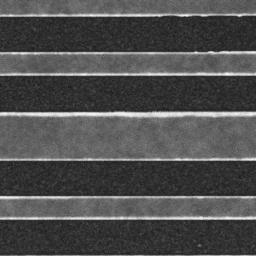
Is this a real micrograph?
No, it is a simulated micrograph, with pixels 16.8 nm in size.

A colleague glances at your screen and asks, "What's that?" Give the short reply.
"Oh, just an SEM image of lines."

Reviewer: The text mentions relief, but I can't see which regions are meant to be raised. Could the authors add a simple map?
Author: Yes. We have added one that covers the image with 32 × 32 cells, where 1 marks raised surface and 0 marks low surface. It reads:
11111111111111111111111111111111
11111111111111111111111111111111
00000000000000000000000000000000
00000000000000000000000000000000
00000000000000000000000000000000
00000000000000000000000000000000
00000000000000000000000000011111
11111111111111111111111111111111
11111111111111111111111111111111
00000000000000000000000000000000
00000000000000000000000000000000
00000000000000000000000000000000
00000000000000000000000000000000
00000000000000000000000000000000
11111111111111111111111111111111
11111111111111111111111111111111
11111111111111111111111111111111
11111111111111111111111111111111
11111111111111111111111111111111
11111111111111111111111111111111
00000000000000000000000000000000
00000000000000000000000000000000
00000000000000000000000000000000
00000000000000000000000000000000
00000000000000000000000000000000
11111111111111111111111111111111
11111111111111111111111111111111
00000000000000000000000000000000
00000000000000000000000000000000
00000000000000000000000000000000
00000000000000000000000000000000
00000000000000000000000000000000